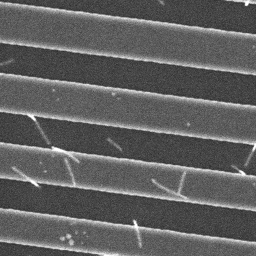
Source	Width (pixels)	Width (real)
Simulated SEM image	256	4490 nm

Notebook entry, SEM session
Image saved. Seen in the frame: lines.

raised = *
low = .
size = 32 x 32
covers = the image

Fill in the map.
**..............................
*********.......................
*****************...............
*************************.......
********************************
..******************************
..........**********************
..................**************
.........................*******
***.............................
**********......................
******************..............
*************************.......
********************************
....****************************
............********************
...................*************
...........................*****
*****...........................
************....................
*********************...........
****************************....
...*****************************
..........**********************
..................**************
.........................*******
***.............................
***********.....................
******************..............
*************************.......
..******************************
..........**********************